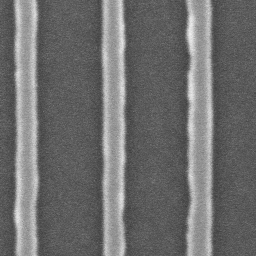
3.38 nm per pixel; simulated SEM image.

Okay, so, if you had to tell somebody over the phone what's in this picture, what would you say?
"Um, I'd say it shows one or a few lines or trenches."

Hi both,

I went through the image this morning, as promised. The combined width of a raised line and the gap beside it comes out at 294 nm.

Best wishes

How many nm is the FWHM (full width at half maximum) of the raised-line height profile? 64.7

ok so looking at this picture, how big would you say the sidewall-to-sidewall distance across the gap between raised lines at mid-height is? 0.229 µm